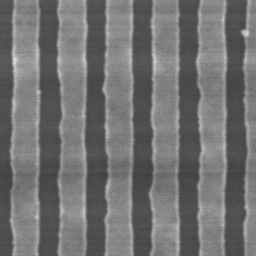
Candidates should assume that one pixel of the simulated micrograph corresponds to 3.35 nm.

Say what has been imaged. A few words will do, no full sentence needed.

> lines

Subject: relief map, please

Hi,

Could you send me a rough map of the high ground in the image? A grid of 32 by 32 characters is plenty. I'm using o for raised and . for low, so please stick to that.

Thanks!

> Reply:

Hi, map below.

..ooo..oooo..oooo..ooo...ooo...o
..ooo..oooo..oooo..ooo...ooo...o
..ooo..oooo..oooo..ooo...ooo...o
..ooo..oooo..oooo..ooo...ooo...o
..ooo..oooo..oooo..ooo...ooo..oo
..ooo..oooo..ooo...ooo...ooo...o
..ooo..oooo..ooo...ooo...ooo...o
..ooo..oooo..ooo...ooo...ooo...o
..ooo..oooo..ooo...ooo...ooo..oo
..ooo..oooo..oooo..ooo...ooo...o
..ooo...ooo..oooo..ooo...ooo...o
..ooo...ooo..oooo..ooo...ooo...o
..ooo...ooo..oooo..ooo...ooo...o
..ooo...ooo..oooo..ooo...ooo...o
.oooo...ooo..oooo..ooo...ooo...o
..ooo..oooo..oooo..ooo...ooo...o
..ooo..oooo..oooo..ooo...ooo...o
.oooo...ooo..oooo..ooo...ooo...o
.oooo...ooo..oooo..ooo...ooo...o
.oooo...ooo...ooo..ooo...ooo...o
.oooo...ooo...ooo..ooo...ooo...o
..ooo..oooo...ooo..ooo...ooo...o
..ooo..oooo...oo...ooo...ooo...o
.oooo..oooo..ooo...ooo...ooo...o
.oooo..oooo..ooo...ooo...ooo...o
.oooo..oooo..ooo...ooo...ooo...o
.oooo..oooo..ooo...ooo...ooo...o
.oooo...ooo..ooo...ooo...ooo...o
.oooo..oooo..oooo..ooo...ooo...o
..ooo..oooo..oooo..ooo...ooo...o
..ooo..oooo..oooo..ooo...ooo...o
..ooo..oooo..oooo..ooo...ooo...o